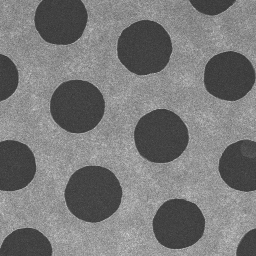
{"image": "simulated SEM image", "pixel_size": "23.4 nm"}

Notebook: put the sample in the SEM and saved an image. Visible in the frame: holes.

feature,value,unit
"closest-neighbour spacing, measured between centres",2080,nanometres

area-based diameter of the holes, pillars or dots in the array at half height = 1280 nanometers